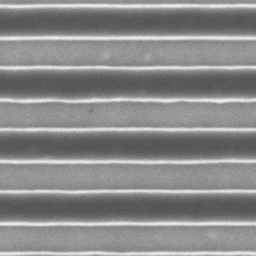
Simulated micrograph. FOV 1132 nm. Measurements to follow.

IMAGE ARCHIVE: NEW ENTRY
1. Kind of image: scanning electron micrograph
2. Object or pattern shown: one or a few lines or trenches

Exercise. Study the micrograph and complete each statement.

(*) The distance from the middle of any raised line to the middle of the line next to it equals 61.9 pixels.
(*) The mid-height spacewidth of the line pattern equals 28.7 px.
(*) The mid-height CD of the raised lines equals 0.148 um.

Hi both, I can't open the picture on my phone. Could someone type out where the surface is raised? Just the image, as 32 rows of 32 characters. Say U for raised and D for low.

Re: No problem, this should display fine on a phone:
DDDDDDDDDDDDDDDDDDDDDDDDDDDDDDDD
UUUUUUUUUUUUUUUUUUUUUUUUUUUUUUUU
UUUUUUUUUUUUUUUUUUUUUUUUUUUUUUUU
UUUUUUUUUUUUUUUUUUUUUUUUUUUUUUUU
UUUUUUUUUUUUUUUUUUUUUUUUUUUUUUUU
DDDDDDDDDDDDDDDDDDDDDDDDDDDDDDDD
DDDDDDDDDDDDDDDDDDDDDDDDDDDDDDDD
DDDDDDDDDDDDDDDDDDDDDDDDDDDDDDDD
UDUUUUUUUUUUUUDDDDDUUDDUUUUUDUUU
UUUUUUUUUUUUUUUUUUUUUUUUUUUUUUUU
UUUUUUUUUUUUUUUUUUUUUUUUUUUUUUUU
UUUUUUUUUUUUUUUUUUUUUUUUUUUUUUUU
DUUUUUUUUUUUUDDDDDDUUUDUUUUUUDUU
DDDDDDDDDDDDDDDDDDDDDDDDDDDDDDDD
DDDDDDDDDDDDDDDDDDDDDDDDDDDDDDDD
DDDDDDDDDDDDDDDDDDDDDDDDDDDDDDDD
UUUUUUUUUUUUUUUUUUUUUUUUUUUUUUUU
UUUUUUUUUUUUUUUUUUUUUUUUUUUUUUUU
UUUUUUUUUUUUUUUUUUUUUUUUUUUUUUUU
UUUUUUUUUUUUUUUUUUUUUUUUUUUUUUUU
DDDDDDDDDDDDDDDDDDDDDDDDDDDDDDDD
DDDDDDDDDDDDDDDDDDDDDDDDDDDDDDDD
DDDDDDDDDDDDDDDDDDDDDDDDDDDDDDDD
DDDDDDDDDDDDDDDDDDDDDDDDDDDDDDDD
UUUUUUUUUUUUUUUUUUUUUUUUUUUUUUUU
UUUUUUUUUUUUUUUUUUUUUUUUUUUUUUUU
UUUUUUUUUUUUUUUUUUUUUUUUUUUUUUUU
UUUUUUUUUUUUUUUUUUUUUUUUUUUUUUUU
DDDDDDDDDDDDDDDDDDDDDDDDDDDDDDDD
DDDDDDDDDDDDDDDDDDDDDDDDDDDDDDDD
DDDDDDDDDDDDDDDDDDDDDDDDDDDDDDDD
DDDDDDDDDDDDDDDDDDDDDDDDDDDDDDDD